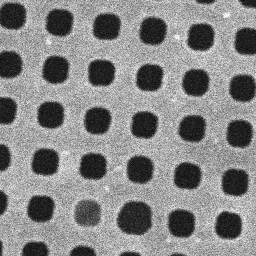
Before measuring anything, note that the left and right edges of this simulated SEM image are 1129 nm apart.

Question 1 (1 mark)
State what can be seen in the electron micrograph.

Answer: a regular array of holes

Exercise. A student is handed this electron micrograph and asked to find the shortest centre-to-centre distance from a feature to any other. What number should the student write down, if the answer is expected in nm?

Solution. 204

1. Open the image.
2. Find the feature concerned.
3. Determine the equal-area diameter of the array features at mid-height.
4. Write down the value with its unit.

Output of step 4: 125 nm